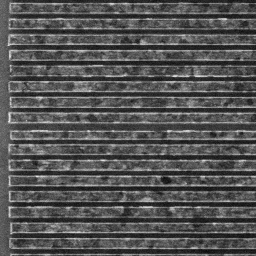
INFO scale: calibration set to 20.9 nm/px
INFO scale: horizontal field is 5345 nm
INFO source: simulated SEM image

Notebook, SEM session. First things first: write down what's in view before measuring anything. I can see parallel lines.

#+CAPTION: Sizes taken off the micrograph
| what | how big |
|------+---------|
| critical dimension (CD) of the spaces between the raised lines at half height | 123 nanometers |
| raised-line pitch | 327 nm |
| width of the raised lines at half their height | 209 nm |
